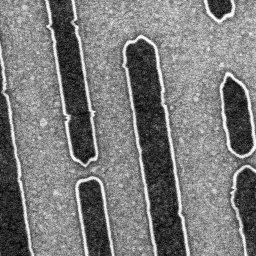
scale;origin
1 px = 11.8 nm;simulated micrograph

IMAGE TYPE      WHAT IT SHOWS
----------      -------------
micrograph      one or a few lines or trenches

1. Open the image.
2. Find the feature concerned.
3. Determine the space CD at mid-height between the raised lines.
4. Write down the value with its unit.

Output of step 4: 0.637 µm